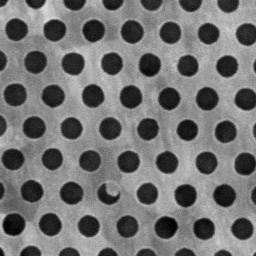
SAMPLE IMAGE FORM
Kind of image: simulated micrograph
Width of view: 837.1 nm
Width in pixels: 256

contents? a regular array of holes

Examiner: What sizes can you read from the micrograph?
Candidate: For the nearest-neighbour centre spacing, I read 121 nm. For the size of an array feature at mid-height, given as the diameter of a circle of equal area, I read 78.7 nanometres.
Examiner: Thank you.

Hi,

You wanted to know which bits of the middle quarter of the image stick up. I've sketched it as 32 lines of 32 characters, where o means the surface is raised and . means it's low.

.....oooo......ooo......oo......
.....oooo.....ooooo.....oooo....
o...ooooooo...oooooo...oooooo...
oooooooooooooooooooooooooooooooo
oooooooooooooooooooooooooooooooo
ooooo....oooooo...oooooooooooooo
ooooo.....oooo.....ooooo....oooo
oooo......oooo......oooo.....ooo
oooo......oooo......ooo......ooo
ooooo.....oooo......oooo.....ooo
ooooo....ooooo.....ooooo.....ooo
ooooooooooooooooooooooooo..ooooo
oooooooooooooooooooooooooooooooo
...ooooooo...ooooooo..oooooooooo
....ooooo.....ooooo....oooooo...
.....oooo.....oooo......oooo....
.....oooo......ooo......oooo....
.....oooo.....oooo......oooo....
....oooooo....ooooo....oooooo...
oooooooooooooooooooooooooooooo.o
oooooooooooooooooooooooooooooooo
ooooo...oooooooo.ooooooooooooooo
oooo.....ooooo.....ooooo....oooo
oooo.....oooo......oooo......ooo
oooo......ooo......oooo......ooo
oooo.....oooo......oooo......ooo
ooooo...oooooo....ooooo.....oooo
ooooooooooooooo.ooooooooo..ooooo
oooooooooooooooooooooooooooooooo
...ooooooo..oooooooooooooooooooo
....ooooo.....ooooo....ooooo....
.....ooo...oo.oooo......oooo....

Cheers